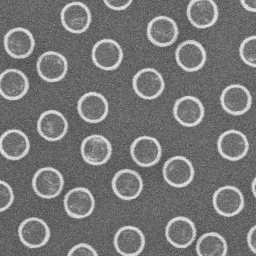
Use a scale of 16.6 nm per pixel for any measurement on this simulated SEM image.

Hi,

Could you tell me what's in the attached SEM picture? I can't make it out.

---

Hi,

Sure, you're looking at a regular array of raised bodies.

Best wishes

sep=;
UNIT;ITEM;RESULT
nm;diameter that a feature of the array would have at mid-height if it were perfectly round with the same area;468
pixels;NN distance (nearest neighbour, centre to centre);42.3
